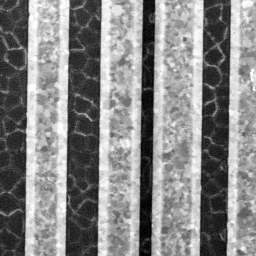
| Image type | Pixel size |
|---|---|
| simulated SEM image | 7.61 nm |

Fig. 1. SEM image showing one or a few lines or trenches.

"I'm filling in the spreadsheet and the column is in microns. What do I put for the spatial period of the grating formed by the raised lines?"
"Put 0.496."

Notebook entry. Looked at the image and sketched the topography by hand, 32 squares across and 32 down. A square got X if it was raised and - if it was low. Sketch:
----XXXX-----XXXX---XXXXX----XXX
----XXXX-----XXXX---XXXXX----XXX
----XXXX-----XXXX---XXXXX----XXX
----XXXX-----XXXX---XXXXX----XXX
----XXXX-----XXXX---XXXXX----XXX
----XXXX-----XXXX---XXXXX----XXX
----XXXX-----XXXX---XXXXX----XXX
----XXXX-----XXXX---XXXXX----XXX
----XXXX-----XXXX---XXXXX----XXX
----XXXX-----XXXX---XXXXX----XXX
----XXXX-----XXXX---XXXXX----XXX
----XXXX-----XXXX---XXXXX----XXX
----XXXX-----XXXX---XXXXX----XXX
----XXXX-----XXXX---XXXXX----XXX
----XXXX-----XXXX---XXXXX----XXX
----XXXX-----XXXX---XXXXX----XXX
----XXXX-----XXXX---XXXXX----XXX
----XXXX-----XXXX---XXXXX----XXX
----XXXX-----XXXX---XXXXX----XXX
----XXXX-----XXXX---XXXXX----XXX
----XXXX-----XXXX---XXXXX----XXX
----XXXX-----XXXX---XXXXX----XXX
----XXXX-----XXXX---XXXX-----XXX
----XXXX-----XXXX---XXXXX----XXX
----XXXX-----XXXX---XXXX-----XXX
----XXXX-----XXXX---XXXX-----XXX
----XXXX-----XXXX---XXXX-----XXX
----XXXX-----XXXX---XXXX-----XXX
----XXXX-----XXXX---XXXX-----XXX
----XXXX-----XXXX---XXXX-----XXX
----XXXX-----XXXX---XXXX-----XXX
----XXXX-----XXXX---XXXX-----XXX